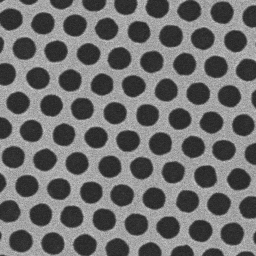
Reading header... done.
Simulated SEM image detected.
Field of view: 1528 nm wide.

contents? a regular array of holes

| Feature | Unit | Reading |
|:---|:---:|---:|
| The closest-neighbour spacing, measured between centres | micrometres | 0.185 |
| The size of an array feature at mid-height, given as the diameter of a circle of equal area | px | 23.2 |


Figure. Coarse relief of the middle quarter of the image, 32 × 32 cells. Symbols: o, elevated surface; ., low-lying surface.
ooooooooooo.....ooo......oo.....
o..ooooooooooooooooo....oooo....
....ooooo.ooooooooooooooooooo...
....ooo.....ooo....ooooooooooooo
....ooo.....oo......oooo...ooooo
....ooo.....oo......ooo.....ooo.
...oooo.....ooo.....ooo.....ooo.
oooooooo...oooo....oooo.....oo..
oooo.oooooooooooooooooo.....ooo.
oo.....ooooo.oooooooooooo.ooooo.
oo.....oooo....oooo....ooooooooo
oo......oo......oo......ooo....o
oo.....ooo......oo......oo.....o
ooo...oooo......oo......oo......
ooooooooooo....ooo.....ooo......
..oooooooooooooooooo..ooooo....o
...ooo....oooooooooooooooooooooo
...oo......ooo....oooo....oooooo
...oo......oo......ooo.....oooo.
..ooo......oo......oo......ooo..
.ooooo....ooo......oo......oo...
oooooooooooooo....oooo.....ooo..
oo...ooooooooooooooooo...ooooo..
o.....ooo....ooooo...ooooooooooo
......ooo.....ooo.....oooo...ooo
......oo......oo......ooo.....oo
o.....ooo.....oo......oo......oo
oo..ooooo.....ooo.....oo......oo
oooooooooooooooooo...oooo.....oo
.ooooo..oooooooooooooooooo...ooo
..oo.....oooo...oooooooooooooooo
..oo......oo.....oooo...oooooo.o